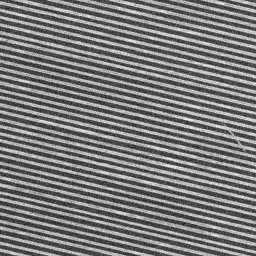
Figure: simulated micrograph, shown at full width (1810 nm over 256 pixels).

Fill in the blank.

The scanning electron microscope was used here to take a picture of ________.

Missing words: parallel lines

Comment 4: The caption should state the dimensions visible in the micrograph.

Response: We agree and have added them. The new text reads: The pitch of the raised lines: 50.1 nm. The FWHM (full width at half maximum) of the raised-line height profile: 18 nm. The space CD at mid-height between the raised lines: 32.8 nm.